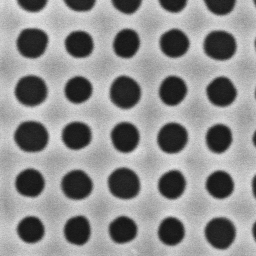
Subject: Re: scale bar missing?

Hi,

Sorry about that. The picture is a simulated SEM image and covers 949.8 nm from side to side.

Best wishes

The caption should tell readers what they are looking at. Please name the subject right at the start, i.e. a regular array of holes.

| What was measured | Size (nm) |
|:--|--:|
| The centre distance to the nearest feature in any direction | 170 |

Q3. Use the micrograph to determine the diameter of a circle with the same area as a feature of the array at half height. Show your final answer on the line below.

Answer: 107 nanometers